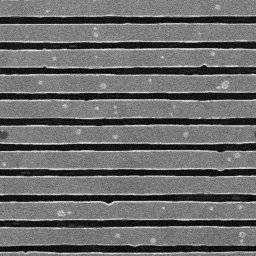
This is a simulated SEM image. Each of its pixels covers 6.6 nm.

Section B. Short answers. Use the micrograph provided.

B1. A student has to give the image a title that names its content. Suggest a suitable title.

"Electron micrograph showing parallel lines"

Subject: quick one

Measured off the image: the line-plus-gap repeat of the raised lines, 25.4 px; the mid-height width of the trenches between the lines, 7.24 px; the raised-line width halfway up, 18.1 pixels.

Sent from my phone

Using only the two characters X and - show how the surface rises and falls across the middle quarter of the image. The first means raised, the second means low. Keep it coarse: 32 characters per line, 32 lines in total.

XXXXXXXXXXXXXXXXXXXXXXXXXXXX----
--------------------------------
--------------------------------
XXXXXXXXXXXXXXXXXXXXXXXXXXXXXXXX
XXXXXXXXXXXXXXXXXXXXXXXXXXXXXXXX
XXXXXXXXXXXXXXXXXXXXXXXXXXXXXXXX
XXXXXXXXXXXXXXXXXXXXXXXXXXXXXXXX
--------------------------------
--------------------------------
XXXXXXXXXXXXXXXXXXXXXXXXXXXXXXXX
XXXXXXXXXXXXXXXXXXXXXXXXXXXXXXXX
XXXXXXXXXXXXXXXXXXXXXXXXXXXXXXXX
XXXXXXXXXXXXXXXXXXXXXXXXXXXXXXXX
------XX-----------------------X
--------------------------------
--------------XXXXXXXXXXXXXXXXXX
XXXXXXXXXXXXXXXXXXXXXXXXXXXXXXXX
XXXXXXXXXXXXXXXXXXXXXXXXXXXXXXXX
XXXXXXXXXXXXXXXXXXXXXXXXXXXXXXXX
XXXXXXXXXXXXXXXXXXXXXXXXXXXXXXXX
--------------------------------
--------------------------------
XXXXXXXXXXXXXXXXXXXXXXXXXXXXXXXX
XXXXXXXXXXXXXXXXXXXXXXXXXXXXXXXX
XXXXXXXXXXXXXXXXXXXXXXXXXXXXXXXX
XXXXXXXXXXXXXXXXXXXXXXXXXXXXXXXX
--------------------------------
--------------------------------
XXXXXXXXXXXXXXXXXXXXXXXXXXXXXXXX
XXXXXXXXXXXXXXXXXXXXXXXXXXXXXXXX
XXXXXXXXXXXXXXXXXXXXXXXXXXXXXXXX
XXXXXXXXXXXXXXXXXXXXXXXXXXXXXXXX